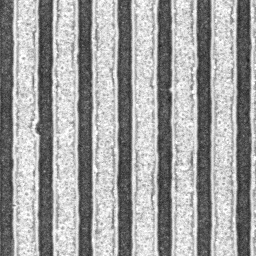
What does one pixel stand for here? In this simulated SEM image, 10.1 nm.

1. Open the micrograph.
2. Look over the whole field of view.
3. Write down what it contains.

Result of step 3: parallel lines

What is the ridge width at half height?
242 nm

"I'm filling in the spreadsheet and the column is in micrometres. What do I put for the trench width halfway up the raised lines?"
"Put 0.165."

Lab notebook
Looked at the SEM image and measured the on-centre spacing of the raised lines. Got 401 nm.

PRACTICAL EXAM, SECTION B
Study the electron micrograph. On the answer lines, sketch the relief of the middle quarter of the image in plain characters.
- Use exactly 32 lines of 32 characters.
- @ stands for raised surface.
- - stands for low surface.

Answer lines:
@@@----@@@@@@----@@@@@@----@@@@@
@@@----@@@@@@----@@@@@@----@@@@@
@@@----@@@@@@----@@@@@@----@@@@@
@@@----@@@@@@----@@@@@@----@@@@@
@@@----@@@@@@----@@@@@@----@@@@@
@@@----@@@@@@----@@@@@@----@@@@@
@@@----@@@@@@-----@@@@@----@@@@@
@@@----@@@@@@-----@@@@@----@@@@@
@@@-----@@@@@-----@@@@@----@@@@@
@@@-----@@@@@-----@@@@@----@@@@@
@@@-----@@@@@-----@@@@@----@@@@@
@@@-----@@@@@-----@@@@@----@@@@@
@@@----@@@@@@-----@@@@@----@@@@@
@@@----@@@@@@-----@@@@@----@@@@@
@@@----@@@@@@-----@@@@@----@@@@@
@@@----@@@@@@-----@@@@@----@@@@@
@@@----@@@@@@-----@@@@@----@@@@@
@@@----@@@@@@-----@@@@@----@@@@@
@@@----@@@@@@----@@@@@@----@@@@@
@@@----@@@@@@----@@@@@@----@@@@@
@@@----@@@@@@----@@@@@@----@@@@@
@@@----@@@@@@-----@@@@@----@@@@@
@@@-----@@@@@----@@@@@@----@@@@@
@@@----@@@@@@----@@@@@@----@@@@@
@@@----@@@@@@----@@@@@@----@@@@@
@@@----@@@@@@----@@@@@@----@@@@@
@@@----@@@@@@----@@@@@@----@@@@@
@@@----@@@@@@----@@@@@@----@@@@@
@@@----@@@@@@----@@@@@@----@@@@@
@@@----@@@@@@----@@@@@@----@@@@@
@@@-----@@@@@----@@@@@@----@@@@@
@@@----@@@@@@----@@@@@@----@@@@@